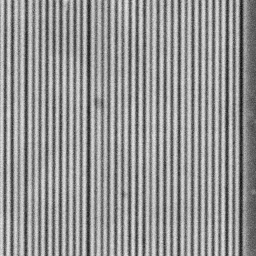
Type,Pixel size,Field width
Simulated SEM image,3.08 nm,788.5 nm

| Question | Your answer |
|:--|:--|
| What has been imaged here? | parallel lines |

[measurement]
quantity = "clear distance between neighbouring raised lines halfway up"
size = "10.8 nanometers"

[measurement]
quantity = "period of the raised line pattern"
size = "21.3 nm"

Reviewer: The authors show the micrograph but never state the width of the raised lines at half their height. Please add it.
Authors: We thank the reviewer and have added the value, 3.51 pixels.